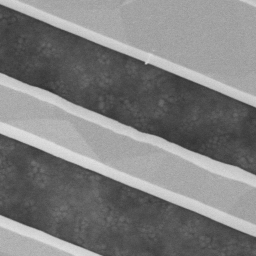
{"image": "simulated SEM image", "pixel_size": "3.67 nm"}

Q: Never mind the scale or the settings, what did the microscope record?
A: one or a few lines or trenches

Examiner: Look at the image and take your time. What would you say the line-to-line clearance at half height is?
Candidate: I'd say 0.269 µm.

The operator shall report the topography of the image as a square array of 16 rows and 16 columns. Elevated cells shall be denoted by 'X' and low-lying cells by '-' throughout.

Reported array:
-XXXXXXXXXXXXXXX
----XXXXXXXXXXXX
------XXXXXXXXXX
---------XXXXXXX
-----------XXXXX
XX------------XX
XXXX------------
XXXXXX----------
-XXXXXXXX-------
----XXXXXXXX----
------XXXXXXXX--
--------XXXXXXXX
-----------XXXXX
-------------XXX
XX--------------
XXXX------------